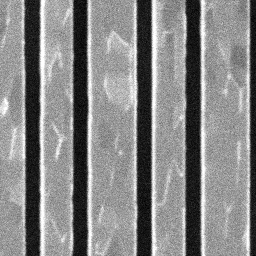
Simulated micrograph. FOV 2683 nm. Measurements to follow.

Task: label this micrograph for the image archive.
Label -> lines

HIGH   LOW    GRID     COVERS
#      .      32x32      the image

###..####..######..####..######.
###..####..######..####..######.
###..####..######..####..######.
###..####..######..####..######.
###..####..######..####..######.
###..####..######..####..######.
###..####..######..####..######.
###..####..######..####..######.
###..####..######..####..######.
###..####..######..####..######.
###..####..######..####..######.
###..####..######..####..######.
###..####..######..####..######.
###..####..######..####..######.
###..####..######..####..######.
###..####..######..####..######.
###..####..######..####..######.
###..####..######..####..######.
###..####..######..####..######.
###..####..######..####..######.
###..####..######..####..######.
###..####..######..####..######.
###..####..######..####..######.
###..####..######..####..######.
###..####..######..####..######.
###..####..######..####..######.
###..####..######..####..######.
###..####..######..####..######.
###..####..######..####..######.
###..####..######..####..######.
###..####..######..####..######.
###..####..######..####..######.